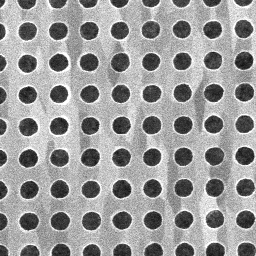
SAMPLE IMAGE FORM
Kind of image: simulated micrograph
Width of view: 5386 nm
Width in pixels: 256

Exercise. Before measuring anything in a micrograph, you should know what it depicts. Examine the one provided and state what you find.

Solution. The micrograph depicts a regular array of holes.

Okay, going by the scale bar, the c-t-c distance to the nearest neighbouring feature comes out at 0.645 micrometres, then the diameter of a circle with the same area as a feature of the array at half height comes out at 401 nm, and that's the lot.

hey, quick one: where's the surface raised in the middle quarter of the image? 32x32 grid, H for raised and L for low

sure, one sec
LLLHLLLLLHHHLLLLHHHHLLLLHHHLLLLL
HLLHHLLLHHHHLLLLHHHHLLLHHHHHHLHH
LLLHHHHHHHHHHHHHHHHHHHHHHHHHHHHH
LLLHHHHLHHHHHHHHHHHHHHHHHHHHHHHH
LLLHHHHLHHHHHHHHHHHHHHHHHHHHHHHH
HLLHHLLLHHHHHLLLHHHHHLLHHHHHLLLH
LLLHLLLLLHHHLLLLHHHHLLLLHHHLLLLL
LLLHLLLLLHHHLLLLLHHLLLLLHHHLLLLL
LLLHLLLLLHHHLLLLHHHHLLLLHHHHLLLL
HLLHHLLLHHHHHLLLHHHHLLLHHHHHHLLH
LLLHHHHHHHHHHHHHHHHHHHHHHHHHHHHH
LLHHHHHHHHHHHHHHHHHHHHHHHHHHHHHH
LLHHHHHHHHHHHHHHHHHHHHHHHHHHHHHH
LLHHHLLLHHHHHLLLHHHHLLLLHHHHLLLL
LHHHLLLLLHHHLLLLLHHHLLLLHHHHLLLL
LHHHLLLLLHHHLLLLLHHLLLLLHHHLLLLL
LHHHLLLLLHHHLLLLHHHHLLLLHHHHLLLL
HHHHHLLLHHHHHLLHHHHHHLLHHHHHHLLH
LHHHHHHHHHHHHHHHHHHHHHHHHHHHHHHH
LHHHHHHHHHHHHHHHHHHHHHHHHHHHHHHH
LHHHHHHHHHHHHLHHHHHHHHHHHHHHHHHH
HHHHHLLLHHHHHLLLHHHHHLLLHHHHLLLL
LHHHLLLLLHHHLLLLLHHHLLLLHHHHLLLL
LHHHLLLLLHHHLLLLLHHHLLLLHHHLLLLL
LHHHLLLLLHHHLLLLLHHHLLLLHHHHLLLL
HHHHHLLLHHHHHLLHHHHHHLLHHHHHHLHH
HHHHHHHHHHHHHHHHHHHHHHHHHHHHHHHH
HHHHHHHHHHHHHHHHHHHHHHHHHHHHHHHH
HHHHHHHHHHHHHHHHHHHHHHHHHHHHHHHH
HHHHHLLLHHHHHLLLHHHHLLLLHHHHLLLL
LHHHHLLLLHHHLLLLLHHHLLLLHHHHLLLL
LHHHLLLLLHHHLLLLLHHHLLLLLHHLLLLL